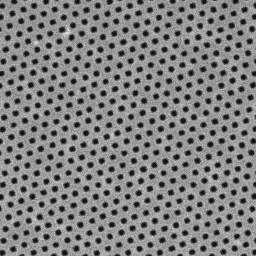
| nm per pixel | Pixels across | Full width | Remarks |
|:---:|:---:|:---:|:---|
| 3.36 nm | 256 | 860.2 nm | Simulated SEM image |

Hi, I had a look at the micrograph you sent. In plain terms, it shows a regular array of holes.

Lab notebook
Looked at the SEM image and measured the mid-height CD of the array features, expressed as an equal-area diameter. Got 20.8 nanometers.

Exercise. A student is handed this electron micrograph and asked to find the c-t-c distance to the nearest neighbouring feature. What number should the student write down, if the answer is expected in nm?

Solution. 38.8